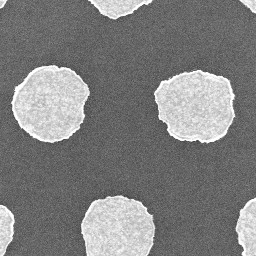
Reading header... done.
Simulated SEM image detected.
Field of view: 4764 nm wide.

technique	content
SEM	raised bodies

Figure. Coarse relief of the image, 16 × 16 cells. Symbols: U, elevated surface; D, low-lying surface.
DDDDDDUUUDDDDDDD
DDDDDDDDDDDDDDDD
DDDDDDDDDDDDDDDD
DDDDDDDDDDDDDDDD
DDUUUDDDDDDDDDDD
DUUUUDDDDDUUUUDD
DUUUUDDDDDUUUUDD
DUUUUDDDDDUUUUDD
DDUUDDDDDDDUUUDD
DDDDDDDDDDDDDDDD
DDDDDDDDDDDDDDDD
DDDDDDDDDDDDDDDD
DDDDDDUUDDDDDDDD
UDDDDUUUUDDDDDDU
UDDDDUUUUUDDDDDU
DDDDDUUUUDDDDDDU